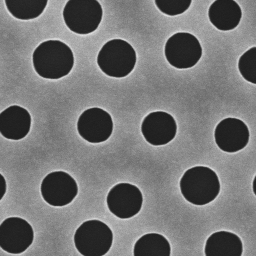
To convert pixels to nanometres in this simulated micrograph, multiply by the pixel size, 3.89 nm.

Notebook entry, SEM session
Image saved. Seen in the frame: a regular array of holes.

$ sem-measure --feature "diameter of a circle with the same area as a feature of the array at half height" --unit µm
0.139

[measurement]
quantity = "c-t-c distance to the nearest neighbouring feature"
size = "249 nm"